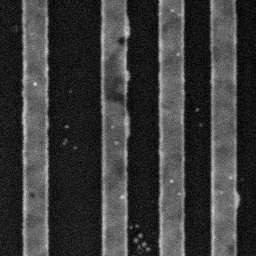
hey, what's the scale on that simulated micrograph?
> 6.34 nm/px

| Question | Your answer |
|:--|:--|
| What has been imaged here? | lines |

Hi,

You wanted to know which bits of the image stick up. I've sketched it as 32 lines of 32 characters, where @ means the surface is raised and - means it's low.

---@@@-------@@@----@@@---@@@---
---@@@-------@@@----@@@---@@@---
---@@@-------@@@----@@@---@@@---
---@@@-------@@@----@@@---@@@---
---@@@-------@@@----@@@---@@@---
---@@@-------@@@----@@@---@@@---
---@@@-------@@@----@@@---@@@---
---@@@-------@@@----@@@---@@@---
---@@@-------@@@----@@@---@@@---
---@@@-------@@@----@@@---@@@---
---@@@-------@@@----@@@---@@@---
---@@@-------@@@----@@@---@@@---
---@@@-------@@@----@@@---@@@---
---@@@-------@@@----@@@---@@@---
---@@@-------@@@----@@@---@@@---
---@@@-------@@@----@@@---@@@---
---@@@-------@@@----@@@---@@@---
---@@@-------@@@----@@@---@@@---
---@@@-------@@@----@@@---@@@---
---@@@-------@@@----@@@---@@@---
---@@@-------@@@----@@@---@@@---
---@@@-------@@@----@@@---@@@---
---@@@-------@@@----@@@---@@@---
---@@@-------@@@----@@@---@@@---
---@@@-------@@@----@@@---@@@---
---@@@-------@@@----@@@---@@@---
---@@@-------@@@----@@@---@@@@--
---@@@-------@@@----@@@---@@@---
---@@@-------@@@----@@@---@@@---
---@@@-------@@@----@@@---@@@---
---@@@-------@@@----@@@---@@@---
---@@@-------@@@----@@@---@@@---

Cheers